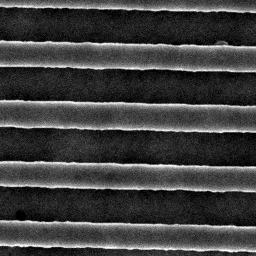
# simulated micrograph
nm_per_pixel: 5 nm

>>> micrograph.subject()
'lines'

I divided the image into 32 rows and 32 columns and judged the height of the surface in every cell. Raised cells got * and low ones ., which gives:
********************************
.............................***
................................
................................
................................
***************.................
********************************
********************************
.........***********************
................................
................................
................................
................................
********************************
********************************
********************************
...........................*..**
................................
................................
................................
***************.................
********************************
********************************
......*.************************
................................
................................
................................
................................
********************************
********************************
********************************
................................